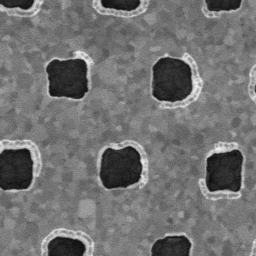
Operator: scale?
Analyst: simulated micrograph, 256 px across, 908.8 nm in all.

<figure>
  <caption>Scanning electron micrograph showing holes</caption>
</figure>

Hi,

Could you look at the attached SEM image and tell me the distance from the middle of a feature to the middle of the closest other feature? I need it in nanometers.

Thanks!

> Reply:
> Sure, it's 366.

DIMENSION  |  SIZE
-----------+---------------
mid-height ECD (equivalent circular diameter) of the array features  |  44.4 px